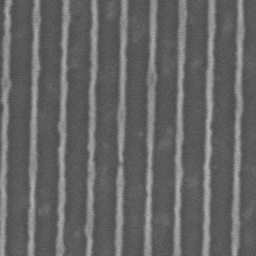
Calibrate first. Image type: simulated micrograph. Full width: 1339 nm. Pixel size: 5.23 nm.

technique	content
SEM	parallel lines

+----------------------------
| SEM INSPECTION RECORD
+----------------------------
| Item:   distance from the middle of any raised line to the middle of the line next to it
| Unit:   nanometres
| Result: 152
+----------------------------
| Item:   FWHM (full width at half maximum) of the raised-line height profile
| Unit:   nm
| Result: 22.9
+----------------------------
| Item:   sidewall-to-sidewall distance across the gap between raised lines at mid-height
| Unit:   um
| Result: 0.129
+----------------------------